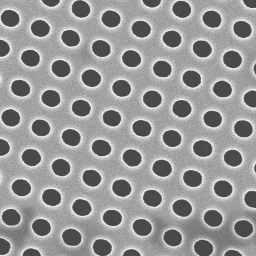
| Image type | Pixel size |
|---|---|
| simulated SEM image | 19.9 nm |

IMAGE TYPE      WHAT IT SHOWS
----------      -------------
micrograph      a regular array of holes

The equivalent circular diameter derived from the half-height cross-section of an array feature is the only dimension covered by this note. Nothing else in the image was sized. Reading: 360 nanometers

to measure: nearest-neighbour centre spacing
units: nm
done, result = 621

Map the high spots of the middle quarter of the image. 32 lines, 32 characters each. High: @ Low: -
-@@@@@@@@@@@@@@@--@@@@-----@@@@@
--@@@@-@@@@@@@@@@@@@@@-----@@@@@
-@@@@----@@@@@@@@@@@@@@----@@@--
@@@@-----@@@@@@@@@@@@@@@@@@@@@--
@@@@@----@@@@---@@@@@@@@@@@@@@--
@@@@@@--@@@@-----@@@@@@@@@@@@@@-
@@@@@@@@@@@@-----@@@@@@@@@@@@@@@
@@@@@@@@@@@@@---@@@@----@@@@@@@@
@@@@@@@@@@@@@@@@@@@@----@@@@@@@@
@@@---@@@@@@@@@@@@@@----@@@@---@
@@-----@@@@@@@@@@@@@@--@@@@-----
@@-----@@@@@@@@@@@@@@@@@@@@-----
@@@---@@@@----@@@@@@@@@@@@@@---@
@@@@@@@@@@----@@@@@@@@@@@@@@@@@@
@@@@@@@@@@----@@@@---@@@@@@@@@@@
@@@@@@@@@@@--@@@@-----@@@@@@@@@@
--@@@@@@@@@@@@@@@-----@@@@@@@@@@
----@@@@@@@@@@@@@@---@@@@----@@@
----@@@@@@@@@@@@@@@@@@@@@----@@@
----@@@@---@@@@@@@@@@@@@@----@@@
@@-@@@@-----@@@@@@@@@@@@@@--@@@@
@@@@@@@-----@@@@-@@@@@@@@@@@@@@@
@@@@@@@@---@@@@----@@@@@@@@@@@@@
@@@@@@@@@@@@@@@----@@@@@@@@@@@@@
-@@@@@@@@@@@@@@----@@@@---@@@@@@
--@@@@@@@@@@@@@@--@@@@-----@@@@@
--@@@@-@@@@@@@@@@@@@@@-----@@@@-
-@@@@----@@@@@@@@@@@@@@---@@@@--
@@@@@----@@@@@@@@@@@@@@@@@@@@@--
@@@@@----@@@@---@@@@@@@@@@@@@@--
@@@@@@--@@@@-----@@@@@@@@@@@@@@-
@@@@@@@@@@@@-----@@@@--@@@@@@@@@